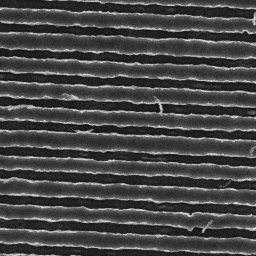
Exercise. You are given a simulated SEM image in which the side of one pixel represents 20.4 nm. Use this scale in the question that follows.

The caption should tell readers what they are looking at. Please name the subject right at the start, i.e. parallel lines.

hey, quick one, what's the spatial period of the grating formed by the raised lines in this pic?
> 499 nm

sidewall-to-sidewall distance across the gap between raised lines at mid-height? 196 nanometers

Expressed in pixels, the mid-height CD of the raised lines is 15.4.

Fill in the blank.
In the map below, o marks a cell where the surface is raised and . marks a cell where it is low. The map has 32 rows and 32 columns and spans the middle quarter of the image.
oooooooooooooooooooooooooooooooo
oooooooooooooooooooooooooooooooo
oooooooooooooooooooooooooooooooo
.....................oooo.oooooo
................................
oooooo..........................
oooooooooooooooooooooooooooooooo
oooooooooooooooooooooooooooooooo
oooooooooooooooooooooooooooooooo
.................ooooooooooooooo
................................
ooo..o..........................
ooooooooooooooooooooooooo.oo....
oooooooooooooooooooooooooooooooo
oooooooooooooooooooooooooooooooo
...............o....oooooooooooo
................................
ooooooooooo.o...................
oooooooooooooooooooooooooooooooo
oooooooooooooooooooooooooooooooo
oooooooooooooooooooooooooooooooo
....oo.oooooo..ooooooooooooooooo
............................oooo
oo..............................
ooooooooooooooooooo...o.........
oooooooooooooooooooooooooooooooo
oooooooooooooooooooooooooooooooo
.............ooooooooooooooooooo
................................
................................
oooooooooooooooooo..o...........
oooooooooooooooooooooooooooooooo